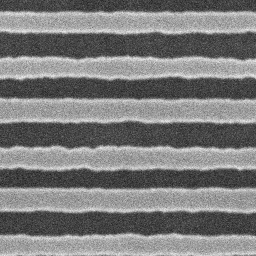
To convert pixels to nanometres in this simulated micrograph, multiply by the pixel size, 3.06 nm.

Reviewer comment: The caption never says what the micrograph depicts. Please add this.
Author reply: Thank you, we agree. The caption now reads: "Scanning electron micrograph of lines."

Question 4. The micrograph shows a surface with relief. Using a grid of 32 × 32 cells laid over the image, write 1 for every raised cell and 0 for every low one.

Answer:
00000000000000000000000000000000
00000000000000000000000000000000
11111111111111111111111111111111
11111111111111111111111111111111
00000000000000000000000000000000
00000000000000000000000000000000
00000000000000000000000000000000
11111111111111111111111111111101
11111111111111111111111111111111
11111111111111111111111111111111
00000000000000000000000000000000
00000000000000000000000000000000
11111111111111111111101111111010
11111111111111111111111111111111
11111111111111111111111111111111
00000000000000000000000000000000
00000000000000000000000000000000
00000000000000000000000000000000
01111111001011111111110010100001
11111111111111111111111111111111
11111111111111111111111111111111
00000000000000000000000000000000
00000000000000000000000000000000
00000000000000000000000000000000
11111111111111111111111111111111
11111111111111111111111111111111
00000000000000000000000000000010
00000000000000000000000000000000
00000000000000000000000000000000
00100000000001111101111000000100
11111111111111111111111111111111
11111111111111111111111111111111